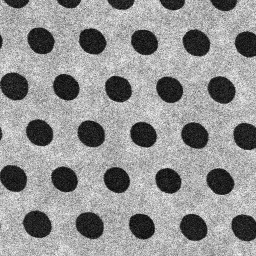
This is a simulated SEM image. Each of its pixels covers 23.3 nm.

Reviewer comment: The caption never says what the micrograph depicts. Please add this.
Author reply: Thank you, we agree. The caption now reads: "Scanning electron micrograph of a regular array of holes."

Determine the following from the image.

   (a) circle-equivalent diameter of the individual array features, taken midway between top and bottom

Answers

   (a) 626 nm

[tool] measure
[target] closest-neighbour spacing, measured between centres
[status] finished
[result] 51.7 px